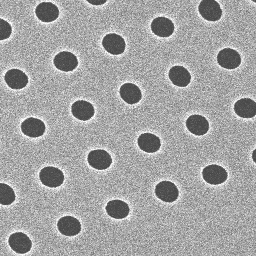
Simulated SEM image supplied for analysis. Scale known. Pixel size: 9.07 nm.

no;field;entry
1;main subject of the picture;a regular array of holes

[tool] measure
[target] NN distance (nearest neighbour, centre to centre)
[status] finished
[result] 51.5 pixels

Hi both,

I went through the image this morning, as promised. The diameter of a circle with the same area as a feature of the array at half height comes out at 204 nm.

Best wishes